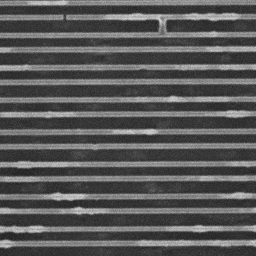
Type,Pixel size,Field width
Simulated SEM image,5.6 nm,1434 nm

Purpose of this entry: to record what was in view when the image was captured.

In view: parallel lines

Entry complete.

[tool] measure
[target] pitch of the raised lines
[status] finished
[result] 90.3 nm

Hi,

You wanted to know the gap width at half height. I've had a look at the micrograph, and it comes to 10.4 px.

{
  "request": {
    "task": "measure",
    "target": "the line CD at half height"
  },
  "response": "23.8 nm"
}